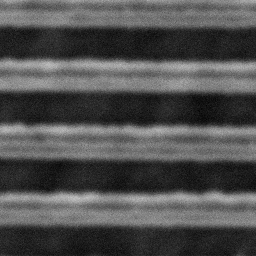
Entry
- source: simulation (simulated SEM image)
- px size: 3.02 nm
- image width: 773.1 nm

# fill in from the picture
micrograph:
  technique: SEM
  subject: lines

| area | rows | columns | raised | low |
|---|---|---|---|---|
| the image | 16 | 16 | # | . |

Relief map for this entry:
################
################
................
................
################
################
................
................
################
################
................
................
################
################
................
................